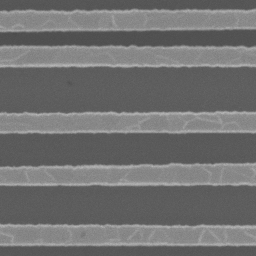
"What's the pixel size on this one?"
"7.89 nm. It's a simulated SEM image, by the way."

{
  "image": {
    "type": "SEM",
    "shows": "lines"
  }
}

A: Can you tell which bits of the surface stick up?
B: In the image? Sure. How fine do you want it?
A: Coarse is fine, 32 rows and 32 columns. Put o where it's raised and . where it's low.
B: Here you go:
................................
.ooooooo.ooooooooooooooooooooooo
oooooooooooooooooooooooooooooooo
oooooooooooooooooooooooooooooooo
................................
................................
oooooooooooooooooooooooooooooooo
oooooooooooooooooooooooooooooooo
................................
................................
................................
................................
................................
................................
oooooooooooooooooooooooooooooooo
oooooooooooooooooooooooooooooooo
ooooooooooooooooooooooooooooo..o
................................
................................
................................
........................o..ooooo
oooooooooooooooooooooooooooooooo
oooooooooooooooooooooooooooooooo
................................
................................
................................
................................
................................
oooooooooooooooooooooooooooooooo
oooooooooooooooooooooooooooooooo
oooooooooooooooooooooooooooooooo
................................